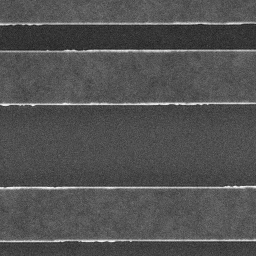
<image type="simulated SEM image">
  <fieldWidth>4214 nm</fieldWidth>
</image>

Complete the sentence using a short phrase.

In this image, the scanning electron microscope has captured lines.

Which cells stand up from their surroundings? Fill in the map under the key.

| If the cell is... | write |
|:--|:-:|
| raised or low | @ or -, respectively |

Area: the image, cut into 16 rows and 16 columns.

@@@@@@@@@@@@@@@@
@@@-------------
----------------
@@@@@@@@@@@@@@@@
@@@@@@@@@@@@@@@@
@@@@@@@@@@@@@@@@
@@@@@@@@@@@@@---
----------------
----------------
----------------
----------------
----------------
@@@@@@@@@@@@@@@@
@@@@@@@@@@@@@@@@
@@@@@@@@@@@@@@@@
----------------